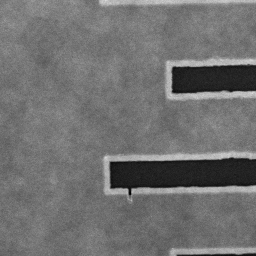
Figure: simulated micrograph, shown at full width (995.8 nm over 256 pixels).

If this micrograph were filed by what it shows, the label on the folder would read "one or a few lines or trenches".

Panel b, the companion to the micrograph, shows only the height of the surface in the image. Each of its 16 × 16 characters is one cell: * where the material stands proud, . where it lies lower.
****************
****************
****************
****************
***********.....
***********.....
****************
****************
****************
****************
*******.........
*******.........
****************
****************
****************
****************